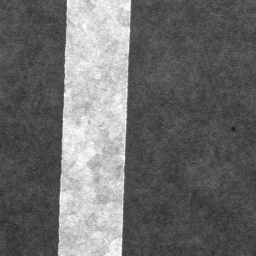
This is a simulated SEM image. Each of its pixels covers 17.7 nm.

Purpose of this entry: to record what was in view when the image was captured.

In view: one or a few lines or trenches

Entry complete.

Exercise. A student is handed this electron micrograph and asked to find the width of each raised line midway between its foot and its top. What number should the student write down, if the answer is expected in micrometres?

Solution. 1.11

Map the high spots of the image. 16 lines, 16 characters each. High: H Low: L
LLLLHHHHLLLLLLLL
LLLLHHHHLLLLLLLL
LLLLHHHHLLLLLLLL
LLLLHHHHLLLLLLLL
LLLLHHHHLLLLLLLL
LLLLHHHHLLLLLLLL
LLLLHHHHLLLLLLLL
LLLLHHHHLLLLLLLL
LLLLHHHHLLLLLLLL
LLLLHHHHLLLLLLLL
LLLLHHHHLLLLLLLL
LLLLHHHHLLLLLLLL
LLLLHHHHLLLLLLLL
LLLLHHHHLLLLLLLL
LLLLHHHHLLLLLLLL
LLLLHHHHLLLLLLLL